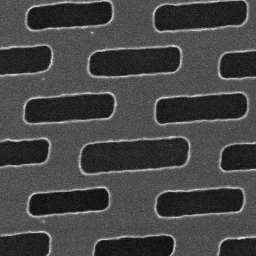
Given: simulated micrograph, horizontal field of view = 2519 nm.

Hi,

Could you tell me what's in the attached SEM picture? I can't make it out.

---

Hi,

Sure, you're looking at holes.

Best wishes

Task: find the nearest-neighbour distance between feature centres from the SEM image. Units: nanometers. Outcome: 785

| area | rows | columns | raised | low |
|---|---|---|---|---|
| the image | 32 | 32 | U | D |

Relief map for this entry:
UUUUUUUDDDDDDDUUUUUUUUUUDDDDDDDU
UUUUDDDDDDDDDDUUUUUDDDDDDDDDDDDU
UUUDDDDDDDDDDDUUUUUDDDDDDDDDDDDU
UUUUDDUUUUUUUUUUUUUUDDDDDDDUUUUU
UUUUUUUUUUUUUUUUUUUUUUUUUUUUUUUU
UUUUUUUUUUUUUUUUUUUUUUUUUUUUUUUU
DDDDDDUUUUUUDDDDDDDDDDUUUUUUUUDD
DDDDDDUUUUUDDDDDDDDDDDDUUUUUDDDD
DDDDDDUUUUUDDDDDDDDDDDUUUUUDDDDD
UUUUUUUUUUUUDDDUUUUUUUUUUUUUDDDD
UUUUUUUUUUUUUUUUUUUUUUUUUUUUUUUU
UUUUUUUUUUUUUUUUUUUUUUUUUUUUUUUU
UUUUDDDDDDDDDDUUUUUUDDDDDDDDDDDU
UUUDDDDDDDDDDDUUUUUUDDDDDDDDDDDU
UUUDDDDDDDDDDDUUUUUUDDDDDDDDDDUU
UUUUUUUUUUUUUUUUUUUUUUUUUUUUUUUU
UUUUUUUUUUUUUUUUUUUUUUUUUUUUUUUU
UUUUDDUUUUUUUUUUUUUDDDDUUUUUUUUU
DDDDDDUUUUDDDDDDDDDDDDDDUUUUDDDD
DDDDDDUUUUDDDDDDDDDDDDDUUUUUDDDD
DDDUUUUUUUDDDDDDDDDDDDDUUUUUDDDD
UUUUUUUUUUUDDUUUUUUUUUUUUUUUUUUU
UUUUUUUUUUUUUUUUUUUUUUUUUUUUUUUU
UUUUUUUUUUUUUUUUUUUUUUUUUUUUUUUU
UUUUDDDDDDDDDDUUUUUUDDDDDDDDDDUU
UUUUDDDDDDDDDDUUUUUUDDDDDDDDDDUU
UUUUDDDDDDUUUUUUUUUUDDDDDDDDDUUU
UUUUUUUUUUUUUUUUUUUUUUUUUUUUUUUU
UUUUUUUUUUUUUUUUUUUUUUUUUUUUUUUU
UDDDDDUUUUUUUUUUUUUDDUUUUUUUUUUU
DDDDDDUUUUUUDDDDDDDDDDUUUUUUDDDD
DDDDDDUUUUUUDDDDDDDDDDUUUUUDDDDD